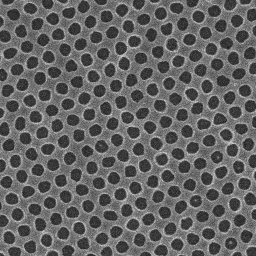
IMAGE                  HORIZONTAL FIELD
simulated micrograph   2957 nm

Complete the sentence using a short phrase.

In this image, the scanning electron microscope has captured a regular array of holes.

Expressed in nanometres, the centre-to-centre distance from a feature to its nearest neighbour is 189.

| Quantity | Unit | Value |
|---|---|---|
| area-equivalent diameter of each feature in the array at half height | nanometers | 148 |